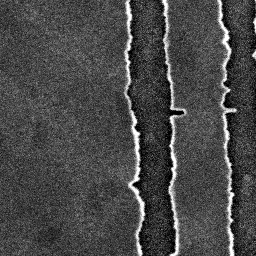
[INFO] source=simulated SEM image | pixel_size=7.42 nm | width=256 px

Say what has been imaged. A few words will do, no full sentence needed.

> one or a few lines or trenches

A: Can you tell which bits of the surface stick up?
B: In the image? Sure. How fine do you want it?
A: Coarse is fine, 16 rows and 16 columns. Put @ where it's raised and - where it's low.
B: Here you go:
@@@@@@@@--@@@@--
@@@@@@@@--@@@@--
@@@@@@@@--@@@@--
@@@@@@@@--@@@@--
@@@@@@@@---@@@--
@@@@@@@@---@@@--
@@@@@@@@---@@@--
@@@@@@@@---@@@--
@@@@@@@@@--@@@--
@@@@@@@@@--@@@--
@@@@@@@@@--@@@--
@@@@@@@@---@@@--
@@@@@@@@@--@@@--
@@@@@@@@@--@@@--
@@@@@@@@@--@@@--
@@@@@@@@@--@@@--